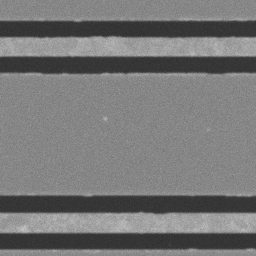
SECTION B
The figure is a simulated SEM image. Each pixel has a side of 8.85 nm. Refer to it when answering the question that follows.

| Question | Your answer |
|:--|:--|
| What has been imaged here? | lines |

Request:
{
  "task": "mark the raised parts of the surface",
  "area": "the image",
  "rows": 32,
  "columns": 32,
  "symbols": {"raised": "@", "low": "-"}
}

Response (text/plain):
@@@@@@@@@@@@@@@@@@@@@@@@@@@@@@@@
@@@@@@@@@@@@@@@@@@@@@@@@@@@@@@@@
@@@@@@@@@@@@@@@@@@@@@@@@@@@@@@@@
--------------------------------
--------------------------------
@@@@@@@@@@@@@@@@@@@@@@@@@@@@@@@@
@@@@@@@@@@@@@@@@@@@@@@@@@@@@@@@@
--------------------------------
--------------------------------
@@@@@@@@@@@@@@@@@@@@@@@@@@@@@@@@
@@@@@@@@@@@@@@@@@@@@@@@@@@@@@@@@
@@@@@@@@@@@@@@@@@@@@@@@@@@@@@@@@
@@@@@@@@@@@@@@@@@@@@@@@@@@@@@@@@
@@@@@@@@@@@@@@@@@@@@@@@@@@@@@@@@
@@@@@@@@@@@@@@@@@@@@@@@@@@@@@@@@
@@@@@@@@@@@@@@@@@@@@@@@@@@@@@@@@
@@@@@@@@@@@@@@@@@@@@@@@@@@@@@@@@
@@@@@@@@@@@@@@@@@@@@@@@@@@@@@@@@
@@@@@@@@@@@@@@@@@@@@@@@@@@@@@@@@
@@@@@@@@@@@@@@@@@@@@@@@@@@@@@@@@
@@@@@@@@@@@@@@@@@@@@@@@@@@@@@@@@
@@@@@@@@@@@@@@@@@@@@@@@@@@@@@@@@
@@@@@@@@@@@@@@@@@@@@@@@@@@@@@@@@
@@@@@@@@@@@@@@@@@@@@@@@@@@@@@@@@
--------------------------------
--------------------------------
--------------------------------
@@@@@@@@@@@@@@@@@@@@@@@@@@@@@@@@
@@@@@@@@@@@@@@@@@@@@@@@@@@@@@@@@
--------------------------------
--------------------------------
@@@@@@@@@@@@@@@@@@@@@@@@@@@@@@@@